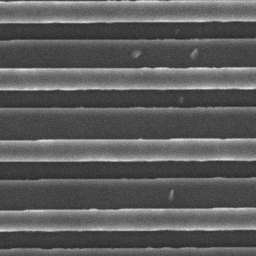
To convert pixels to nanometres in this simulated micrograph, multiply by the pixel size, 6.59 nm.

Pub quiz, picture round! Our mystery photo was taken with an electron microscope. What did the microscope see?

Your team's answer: lines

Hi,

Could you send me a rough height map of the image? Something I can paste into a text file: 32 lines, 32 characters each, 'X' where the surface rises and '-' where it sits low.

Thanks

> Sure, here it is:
XXXXXXXXXXXXXXXXXXXXXXXXXXXXXXXX
XXXXXXXXXXXXXXXXXXXXXXXXXXXXXXXX
XXXXXXXXXXXXXXXXXXXXXXXXXXXXXXXX
--------------------------------
--------------------------------
--------------------------------
--------------------------------
--------------------------------
--------------------------------
XXXXXXXXXXXXXXXXXXXXXXXXXXXXXXXX
XXXXXXXXXXXXXXXXXXXXXXXXXXXXXXXX
--------------------------------
--------------------------------
--------------------------------
--------------------------------
--------------------------------
--------------------------------
-----------------X---XXXXXXXXXXX
XXXXXXXXXXXXXXXXXXXXXXXXXXXXXXXX
XXXXXXXXXXXXXXXXXXXXXXXXXXXXXXXX
--------------------------------
--------------------------------
--------------------------------
--------------------------------
--------------------------------
--------------------------------
XXXXXXXXXXXXXXXXXXXXXXXXXXXXXXXX
XXXXXXXXXXXXXXXXXXXXXXXXXXXXXXXX
XXXXXXXXXXXXXXXXXXXXXXXXXXXXXXXX
--------------------------------
--------------------------------
--------------------------------